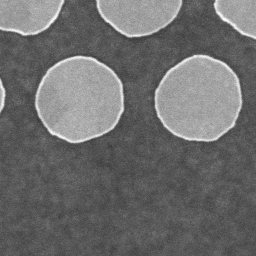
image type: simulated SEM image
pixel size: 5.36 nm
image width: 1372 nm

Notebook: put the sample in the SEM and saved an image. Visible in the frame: raised bodies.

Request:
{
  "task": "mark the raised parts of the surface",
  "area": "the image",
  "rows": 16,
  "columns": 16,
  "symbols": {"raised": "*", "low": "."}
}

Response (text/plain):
****..*****...**
***....***....**
................
............*...
...****....****.
..******..*****.
..******..*****.
...****...*****.
....**.....***..
................
................
................
................
................
................
................